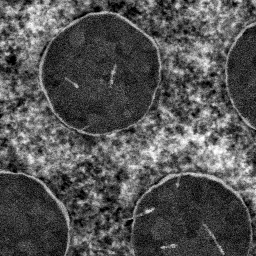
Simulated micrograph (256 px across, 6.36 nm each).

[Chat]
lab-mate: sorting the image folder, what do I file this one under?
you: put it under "raised bodies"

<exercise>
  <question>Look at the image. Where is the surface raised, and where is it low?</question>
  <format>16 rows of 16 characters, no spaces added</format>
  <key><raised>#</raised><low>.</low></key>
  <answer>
....#...........
....####........
...######......#
...#######....##
...#######....##
...#######....##
...######......#
....#####......#
................
................
................
###.......####..
####.....######.
####....########
####....########
####....########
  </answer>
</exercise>